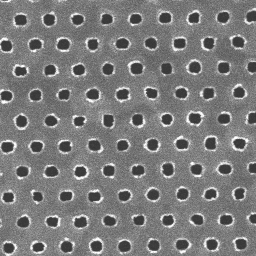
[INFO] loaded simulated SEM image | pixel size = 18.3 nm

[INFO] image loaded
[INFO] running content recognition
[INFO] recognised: a regular array of holes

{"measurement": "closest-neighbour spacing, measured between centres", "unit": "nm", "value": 518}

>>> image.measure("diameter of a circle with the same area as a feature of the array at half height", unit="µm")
0.21